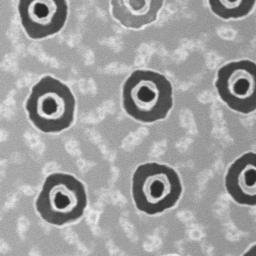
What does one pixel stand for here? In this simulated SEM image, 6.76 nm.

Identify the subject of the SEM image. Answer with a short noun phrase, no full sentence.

ring-shaped grooves with a dot in the middle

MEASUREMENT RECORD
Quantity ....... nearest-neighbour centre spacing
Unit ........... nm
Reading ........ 630